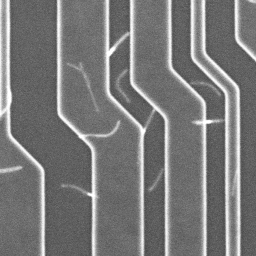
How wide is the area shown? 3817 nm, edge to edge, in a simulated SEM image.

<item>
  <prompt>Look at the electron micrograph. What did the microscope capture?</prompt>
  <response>groups of lines, slits or small figures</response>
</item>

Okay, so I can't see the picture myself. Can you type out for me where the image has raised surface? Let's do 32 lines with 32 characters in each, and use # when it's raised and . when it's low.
#......######...#####...#.....##
#......######...#####...#.....##
#......######...#####...#.....##
#......######...#####...#.....##
#......######...#####...#.....##
#......######...#####...#.....##
#......#######..#####...##.....#
#......######...#####...##......
#......######...#####....##.....
#......######...######....##....
#......######....######....##...
#......#######...#######....##..
#......#######....#######...##..
#......########....#######..##..
#.......########....######..##..
#.......#########....#####..##..
#.........########...#####..##..
##........########...#####..##..
###........#######...#####..##..
####........######...#####..##..
#####.......######...#####..##..
#####.......######...#####..##..
#####.......######...#####..##..
#####.......######...#####..##..
#####.......######...#####..##..
#####.......######...#####..##..
#####.......######...#####..##..
#####.......######...#####..##..
#####.......######...#####..##..
#####.......######...#####..##..
#####.......######...#####..##..
#####.......######...#####..##..